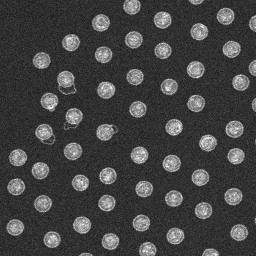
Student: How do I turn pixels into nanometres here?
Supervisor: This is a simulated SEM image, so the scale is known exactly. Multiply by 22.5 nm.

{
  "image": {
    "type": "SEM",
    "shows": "a regular array of holes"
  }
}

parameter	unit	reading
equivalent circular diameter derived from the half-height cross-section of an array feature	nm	352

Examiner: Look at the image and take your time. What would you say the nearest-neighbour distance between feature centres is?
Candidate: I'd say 711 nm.